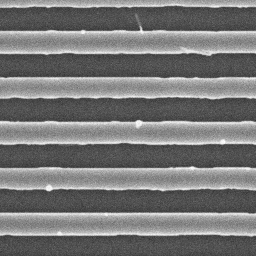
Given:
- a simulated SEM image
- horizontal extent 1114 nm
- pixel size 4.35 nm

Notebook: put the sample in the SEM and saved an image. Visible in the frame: lines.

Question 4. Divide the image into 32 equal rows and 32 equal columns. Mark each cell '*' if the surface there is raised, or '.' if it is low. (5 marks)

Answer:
********************************
................................
................................
................................
********************************
********************************
********************************
................................
................................
................................
********************************
********************************
................................
................................
................................
********************************
********************************
********************************
................................
................................
................................
********************************
********************************
.*******************************
................................
................................
................................
********************************
********************************
................................
................................
................................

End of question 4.